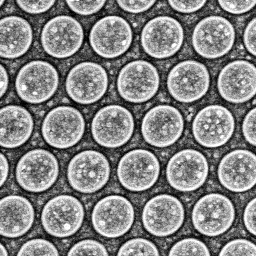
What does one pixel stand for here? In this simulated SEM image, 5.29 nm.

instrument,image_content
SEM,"a regular array of raised bodies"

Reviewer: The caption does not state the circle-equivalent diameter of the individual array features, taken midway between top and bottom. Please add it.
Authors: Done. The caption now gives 212 nm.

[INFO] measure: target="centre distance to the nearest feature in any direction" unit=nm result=264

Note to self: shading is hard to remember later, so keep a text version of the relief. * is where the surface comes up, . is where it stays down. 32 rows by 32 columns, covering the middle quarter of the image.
...*****........******.......***
..********.....********....*****
..********....*********....*****
.*********....*********...******
.**********...*********...******
.*********....*********...******
.*********....*********...******
.*********....********.....*****
..*******......******.......****
....**..........................
................................
***......******.......******....
****.....*******.....********...
****....*********...*********...
*****..**********...**********..
*****..**********...**********..
*****..**********...*********...
****...**********...*********...
****....********....********....
***......******......******.....
*...........*...................
................................
....*****.......******......****
...*******.....********....*****
..*********...*********...******
.**********...**********..******
.**********...**********..******
.**********...*********...******
.**********...*********...******
..********.....*******.....*****
..*******......******......*****
....****.....................**.